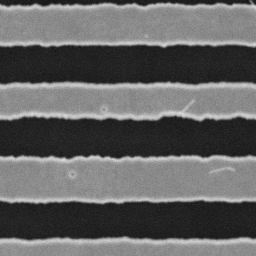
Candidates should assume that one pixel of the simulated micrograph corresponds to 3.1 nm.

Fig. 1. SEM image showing lines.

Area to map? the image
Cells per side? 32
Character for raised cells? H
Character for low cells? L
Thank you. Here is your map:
LLLLLLLLLLLLLHLLLLLHHHHLLLLHLLLL
HHHHHHHHHHHHHHHHHHHHHHHHHHHHHHHH
HHHHHHHHHHHHHHHHHHHHHHHHHHHHHHHH
HHHHHHHHHHHHHHHHHHHHHHHHHHHHHHHH
HHHHHHHHHHHHHHHHHHHHHHHHHHHHHHHH
HHHHHHHHHHHHHHHHHHHHHHHHHHHHHHHH
LLLLLLLLLLLLLLLLLLLLLLLLLLLLLLLL
LLLLLLLLLLLLLLLLLLLLLLLLLLLLLLLL
LLLLLLLLLLLLLLLLLLLLLLLLLLLLLLLL
LLLLLLLLLLLLLLLLLLLLLLLLLLLLLLLL
LHHHHHHHHHHHHLHHHHHHHHHLLHHHHHHH
HHHHHHHHHHHHHHHHHHHHHHHHHHHHHHHH
HHHHHHHHHHHHHHHHHHHHHHHHHHHHHHHH
HHHHHHHHHHHHHHHHHHHHHHHHHHHHHHHH
HHHHHHHHHHHHHHHHHHHHHHHHHHHHHHHH
LLLLLLLLLLLLLLLLLLLLLLLLLLLLLLLL
LLLLLLLLLLLLLLLLLLLLLLLLLLLLLLLL
LLLLLLLLLLLLLLLLLLLLLLLLLLLLLLLL
LLLLLLLLLLLLLLLLLLLLLLLLLLLLLLLL
LLLLLLLLLLLHLLLLLLLLLLHHHLHHLLLL
HHHHHHHHHHHHHHHHHHHHHHHHHHHHHHHH
HHHHHHHHHHHHHHHHHHHHHHHHHHHHHHHH
HHHHHHHHHHHHHHHHHHHHHHHHHHHHHHHH
HHHHHHHHHHHHHHHHHHHHHHHHHHHHHHHH
HHHHHHHHHHHHHHHHHHHHHHHHHHHHHHHH
LLLLLLLLLLLLLLLLLLLLLLLLLLLLLLLL
LLLLLLLLLLLLLLLLLLLLLLLLLLLLLLLL
LLLLLLLLLLLLLLLLLLLLLLLLLLLLLLLL
LLLLLLLLLLLLLLLLLLLLLLLLLLLLLLLL
LLLLLLLLLLLLLLLLLLLLLLLLLLLLLLLL
HHHHHHHHHHHHHHHHHHHHHHHHHHHHHHHH
HHHHHHHHHHHHHHHHHHHHHHHHHHHHHHHH